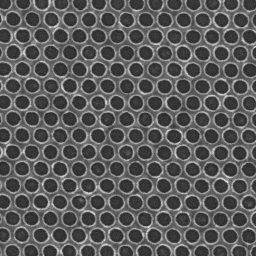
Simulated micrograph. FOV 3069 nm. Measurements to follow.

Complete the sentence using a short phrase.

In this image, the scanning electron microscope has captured a regular array of holes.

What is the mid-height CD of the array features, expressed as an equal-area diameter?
175 nanometers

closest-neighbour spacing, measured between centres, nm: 225